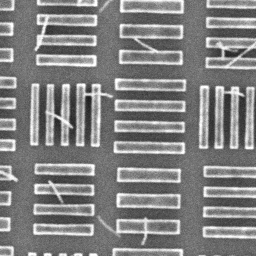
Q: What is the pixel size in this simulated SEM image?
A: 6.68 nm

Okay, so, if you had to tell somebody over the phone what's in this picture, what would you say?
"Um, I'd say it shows groups of lines, slits or small figures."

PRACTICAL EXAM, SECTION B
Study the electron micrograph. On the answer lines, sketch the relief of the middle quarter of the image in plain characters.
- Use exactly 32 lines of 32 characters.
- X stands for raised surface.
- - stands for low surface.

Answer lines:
--------------------------------
--------------------------------
--------------------------------
--------------------------------
-------------XXXXXXXXXXXXXXXXX--
X---X--XX----XXXXXXXXXXXXXXXXX--
X--XX--XX-----------XXXXXXXXXX--
X--XX--XX-----------------------
X--XX--XX-----------------------
X--XX--XX----XXXXXXXXXXXXXXXXX--
X--XX--XX----XXXXXXXXXXXXXXXXX--
X--XX--XX----XXXXXXXXXXXXXXXXX--
X--XX--XX-----------------------
X--XX--XX-----------------------
X--XX--XX----X------------------
XX-XX--XX----XXXXXXXXXXXXXXXXX--
X--XX--XX----XXXXXXXXXXXXXXXXX--
X--XX--XX-----------------------
X--XX--XX-----------------------
X--XX--XX-----------------------
-------------XXXXXXXXXXXXXXXXX--
-------------XXXXXXXXXXXXXXXXX--
--------------------------------
--------------------------------
--------------------------------
XXXXXXX-------------------------
XXXXXXX-------XXXXXXXXXXXXXXX---
XXXXXXX------XXXXXXXXXXXXXXXX---
-------------XXXXXXXXXXXXXXXX---
--------------------------------
XXXXXXX-------------------------
XXXXXXX-------------------------